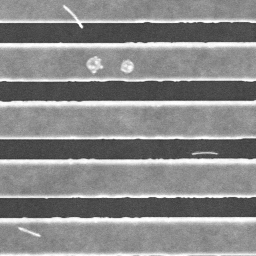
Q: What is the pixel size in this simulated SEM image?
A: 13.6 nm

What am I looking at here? lines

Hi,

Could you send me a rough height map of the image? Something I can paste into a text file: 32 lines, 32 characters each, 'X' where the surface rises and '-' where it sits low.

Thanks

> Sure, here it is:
XXXXXXXXXXXXXXXXXXXXXXXXXXXXXXXX
XXXXXXXXXXXXXXXXXXXXXXXXXXXXXXXX
XXXXXXXXXXXXXXXXXXXXXXXXXXXXXXXX
--------------------------------
--------------------------------
XXXXXXXXXXXXXXXXXXXXXXXXXXXXXXXX
XXXXXXXXXXXXXXXXXXXXXXXXXXXXXXXX
XXXXXXXXXXXXXXXXXXXXXXXXXXXXXXXX
XXXXXXXXXXXXXXXXXXXXXXXXXXXXXXXX
XXXXXXXXXXXXXXXXXXXXXXXXXXXXXXXX
--------------------------------
--------------------------------
--------------------------------
XXXXXXXXXXXXXXXXXXXXXXXXXXXXXXXX
XXXXXXXXXXXXXXXXXXXXXXXXXXXXXXXX
XXXXXXXXXXXXXXXXXXXXXXXXXXXXXXXX
XXXXXXXXXXXXXXXXXXXXXXXXXXXXXXXX
--------------------------------
--------------------------------
--------------------------------
XXXXXXXXXXXXXXXXXXXXXXXXXXXXXXXX
XXXXXXXXXXXXXXXXXXXXXXXXXXXXXXXX
XXXXXXXXXXXXXXXXXXXXXXXXXXXXXXXX
XXXXXXXXXXXXXXXXXXXXXXXXXXXXXXXX
XXXXXXXXXXXXXXXXXXXXXXXXXXXXXXXX
--------------------------------
--------------------------------
XXXXXXXXXXXXXXXXXXXXXXXXXXXXXXXX
XXXXXXXXXXXXXXXXXXXXXXXXXXXXXXXX
XXXXXXXXXXXXXXXXXXXXXXXXXXXXXXXX
XXXXXXXXXXXXXXXXXXXXXXXXXXXXXXXX
XXXXXXXXXXXXXXXXXXXXXXXXXXXXXXXX